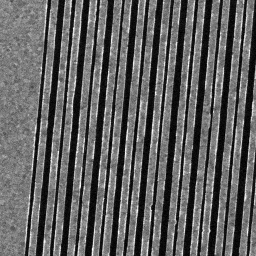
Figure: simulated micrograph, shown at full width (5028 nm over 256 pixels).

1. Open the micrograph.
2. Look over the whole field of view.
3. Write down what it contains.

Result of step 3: parallel lines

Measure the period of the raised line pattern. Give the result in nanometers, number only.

241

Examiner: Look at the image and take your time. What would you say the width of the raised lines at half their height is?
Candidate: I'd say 134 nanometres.